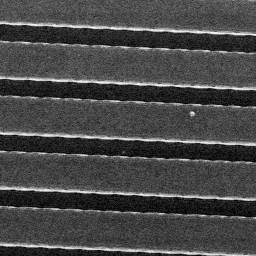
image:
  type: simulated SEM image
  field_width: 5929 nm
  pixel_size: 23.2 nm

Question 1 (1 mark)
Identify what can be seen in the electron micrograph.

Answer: lines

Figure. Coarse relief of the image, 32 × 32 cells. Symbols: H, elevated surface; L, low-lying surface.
HHHHHHHHHHHHHHHHHHHHHHHHHHHHHHHH
HHHHHHHHHHHHHHHHHHHHHHHHHHHHHHHH
HHHHHHHHHHHHHHHHHHHHHHHHHHHHHHHH
LLLLLLLLLLLLLLHHHHHHHHHHHHHHHHHH
LLLLLLLLLLLLLLLLLLLLLLLLLLLLLLLL
HHHHHHLLLLLLLLLLLLLLLLLLLLLLLLLL
HHHHHHHHHHHHHHHHHHHHHHHHHHHHHLLL
HHHHHHHHHHHHHHHHHHHHHHHHHHHHHHHH
HHHHHHHHHHHHHHHHHHHHHHHHHHHHHHHH
HHHHHHHHHHHHHHHHHHHHHHHHHHHHHHHH
LLLLLLLLLLLLLLLLLHHHHHHHHHHHHHHH
LLLLLLLLLLLLLLLLLLLLLLLLLLLLLLLL
HHHHHHHHHHLLLLLLLLLLLLLLLLLLLLLL
HHHHHHHHHHHHHHHHHHHHHHHHHHHHHHHH
HHHHHHHHHHHHHHHHHHHHHHHHHHHHHHHH
HHHHHHHHHHHHHHHHHHHHHHHHHHHHHHHH
HHHHHHHHHHHHHHHHHHHHHHHHHHHHHHHH
LLLLLLLLLLLLLLLLLLHHHHHHHHHHHHHH
LLLLLLLLLLLLLLLLLLLLLLLLLLLLLLLL
HHHHHHHHHHHLLLLLLLLLLLLLLLLLLLLL
HHHHHHHHHHHHHHHHHHHHHHHHHHHHHHHH
HHHHHHHHHHHHHHHHHHHHHHHHHHHHHHHH
HHHHHHHHHHHHHHHHHHHHHHHHHHHHHHHH
HHHHHHHHHHHHHHHHHHHHHHHHHHHHHHHH
LLLLLLLLLLLLLLLLLLLLHHHHHHHHHHHH
LLLLLLLLLLLLLLLLLLLLLLLLLLLLLLLL
HHHHHHHHHHHHHHHLLLLLLLLLLLLLLLLL
HHHHHHHHHHHHHHHHHHHHHHHHHHHHHHHH
HHHHHHHHHHHHHHHHHHHHHHHHHHHHHHHH
HHHHHHHHHHHHHHHHHHHHHHHHHHHHHHHH
HHHHHHHHHHHHHHHHHHHHHHHHHHHHHHHH
LLLLLLLLLLLLLLLLLLLLLHHHHHHHHHHH